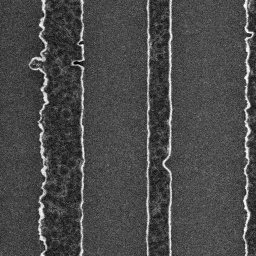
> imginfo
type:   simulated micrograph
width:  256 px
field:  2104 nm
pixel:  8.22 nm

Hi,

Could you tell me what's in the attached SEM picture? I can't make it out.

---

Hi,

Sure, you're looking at one or a few lines or trenches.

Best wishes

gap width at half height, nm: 572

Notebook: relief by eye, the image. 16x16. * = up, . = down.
...**....**....*
...**....**....*
...**....**.....
..***....**....*
..***....**....*
...**....**....*
...**....**....*
..***....**....*
...**....**....*
...**....**....*
...**....*.....*
...**....**....*
...**....**....*
...**....**....*
..***....**....*
...**....**....*